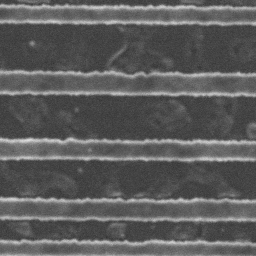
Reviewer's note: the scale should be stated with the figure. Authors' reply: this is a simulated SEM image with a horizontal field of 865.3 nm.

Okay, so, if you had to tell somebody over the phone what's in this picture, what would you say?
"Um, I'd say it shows lines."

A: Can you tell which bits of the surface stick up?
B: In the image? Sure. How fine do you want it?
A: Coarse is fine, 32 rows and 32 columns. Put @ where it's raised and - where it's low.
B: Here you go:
--------------------------------
@@@@@@@@@@@@@@@@@@@@@@@@@@@@@@@@
@@@@@@@@@@@@@@@@@@@@@@@@@@@@@@@@
--------------------------------
--------------------------------
--------------------------------
--------------------------------
--------------------------------
--------------------------------
@@@@@@@@@@@@@@@@@@@@@@@@@@@@@@@@
@@@@@@@@@@@@@@@@@@@@@@@@@@@@@@@@
@@@@@@@@@@@@@@@@@@@@@@@@@@@@@@@@
--------------------------------
--------------------------------
--------------------------------
--------------------------------
--------------------------------
@@@@@@@-@@-@@@@---@@@@----------
@@@@@@@@@@@@@@@@@@@@@@@@@@@@@@@@
@@@@@@@@@@@@@@@@@@@@@@@@@@@@@@@@
--------------------------------
--------------------------------
--------------------------------
--------------------------------
--------------------------------
@@@@@@@@@@@@@@@@@@@@@@@@@@@@@@@@
@@@@@@@@@@@@@@@@@@@@@@@@@@@@@@@@
-----@@--@@-@@@@@@@@@@@@@@@@@@@@
--------------------------------
--------------------------------
@@@@@@@@@@@@@@@@@@@@@@@@@@@@@@@@
@@@@@@@@@@@@@@@@@@@@@@@@@@@@@@@@